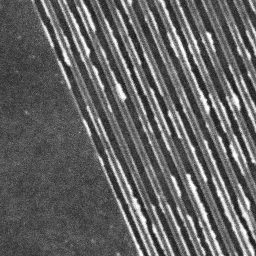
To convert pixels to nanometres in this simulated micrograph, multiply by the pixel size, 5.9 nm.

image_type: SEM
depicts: parallel lines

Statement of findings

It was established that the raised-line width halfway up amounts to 46.2 nanometres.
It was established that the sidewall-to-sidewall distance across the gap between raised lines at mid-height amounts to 40.8 nm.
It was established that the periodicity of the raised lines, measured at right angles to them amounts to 86.8 nanometres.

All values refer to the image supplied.